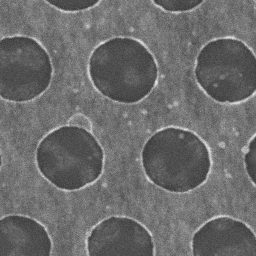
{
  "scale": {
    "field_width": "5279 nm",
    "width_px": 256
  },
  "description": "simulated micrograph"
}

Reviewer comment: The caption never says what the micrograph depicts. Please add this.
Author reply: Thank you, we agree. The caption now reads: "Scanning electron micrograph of holes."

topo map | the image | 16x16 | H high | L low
HHHHLLHHHHLLHHHH
HHHHHHHHHHHHHHHH
LLHHHHHLHHHHHLLH
LLLHHHLLLHHHLLLL
LLLHHHLLLLHHLLLL
LLLHHHLLLLHHHLLL
HHHHHHHHHHHHHHHH
HHHHHHHHHHHHHHHH
HHHLLLHHHHLLHHHH
HHLLLLHHHLLLLHHL
HHLLLLHHHLLLLHHL
HHHLLLHHHHLLLHHH
HHHHHHHHHHHHHHHH
HHHHHHHHHHHHHHHH
LLLHHHLLLHHHLLLL
LLLHHLLLLLHHLLLL